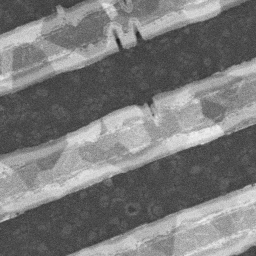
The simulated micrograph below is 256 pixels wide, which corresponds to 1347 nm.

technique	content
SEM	one or a few lines or trenches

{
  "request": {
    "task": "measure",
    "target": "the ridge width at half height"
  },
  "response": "226 nm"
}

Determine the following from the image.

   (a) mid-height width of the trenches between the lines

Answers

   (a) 0.378 µm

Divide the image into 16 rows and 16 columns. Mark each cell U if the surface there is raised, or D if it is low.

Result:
DDDDDDUUUUUUUDDD
DDDUUUUUUUDDDDDD
DUUUUUUDDDDDDDDD
UUUUUDDDDDDDDDDD
UUUDDDDDDDDDDDDU
DDDDDDDDDDDDUUUU
DDDDDDDDDDUUUUUU
DDDDDDDUUUUUUUUD
DDDDDUUUUUUUUDDD
DDDUUUUUUUDDDDDD
UUUUUUUDDDDDDDDD
UUUUUDDDDDDDDDDD
UUDDDDDDDDDDDDDU
DDDDDDDDDDDDUUUU
DDDDDDDDDUUUUUUU
DDDDDDDUUUUUUUUD